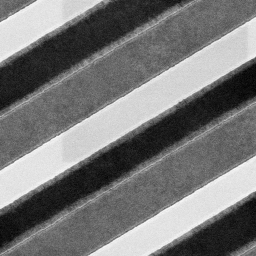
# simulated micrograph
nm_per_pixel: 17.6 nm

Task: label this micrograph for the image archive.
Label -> lines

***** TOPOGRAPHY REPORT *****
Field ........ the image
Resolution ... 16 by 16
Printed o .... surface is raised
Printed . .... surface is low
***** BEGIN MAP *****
oooooo.....ooooo
oooo......oooooo
oo......oooooooo
o.....oooooooooo
.....ooooooooo..
...oooooooooo...
.oooooooooo.....
ooooooooo.....oo
oooooooo....oooo
oooooo.....ooooo
oooo.....ooooooo
ooo....ooooooooo
o.....ooooooooo.
....ooooooooo...
..oooooooooo....
.ooooooooo......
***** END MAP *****